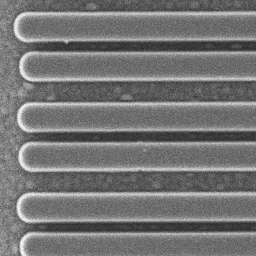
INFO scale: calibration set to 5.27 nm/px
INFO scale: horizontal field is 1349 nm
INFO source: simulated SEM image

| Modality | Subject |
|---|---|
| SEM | parallel lines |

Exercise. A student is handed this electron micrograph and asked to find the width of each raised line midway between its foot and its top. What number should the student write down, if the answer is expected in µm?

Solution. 0.147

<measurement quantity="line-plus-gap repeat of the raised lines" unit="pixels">45.2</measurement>